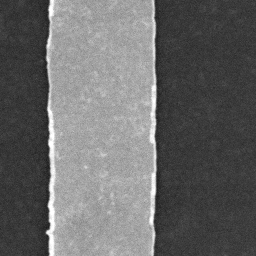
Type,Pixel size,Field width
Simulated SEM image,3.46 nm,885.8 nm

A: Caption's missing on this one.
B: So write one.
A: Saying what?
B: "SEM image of one or a few lines or trenches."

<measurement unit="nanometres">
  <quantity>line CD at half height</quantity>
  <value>365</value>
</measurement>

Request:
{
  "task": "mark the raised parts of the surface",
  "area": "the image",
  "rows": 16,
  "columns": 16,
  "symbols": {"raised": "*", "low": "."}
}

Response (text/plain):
...*******......
...*******......
...*******......
...*******......
...*******......
...*******......
...*******......
...*******......
...*******......
...*******......
...*******......
...*******......
...*******......
...*******......
...*******......
...*******......